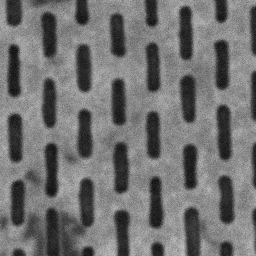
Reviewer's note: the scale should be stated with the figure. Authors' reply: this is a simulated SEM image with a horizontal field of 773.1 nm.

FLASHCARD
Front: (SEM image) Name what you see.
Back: a regular array of holes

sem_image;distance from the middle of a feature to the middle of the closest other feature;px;47.4